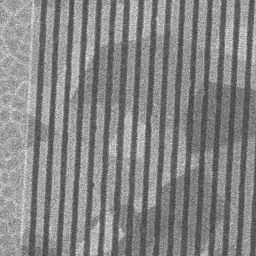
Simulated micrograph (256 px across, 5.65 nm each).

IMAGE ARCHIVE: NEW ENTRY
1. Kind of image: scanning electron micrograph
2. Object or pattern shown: parallel lines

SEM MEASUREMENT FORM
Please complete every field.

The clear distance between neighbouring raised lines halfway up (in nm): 29.6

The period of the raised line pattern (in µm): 0.078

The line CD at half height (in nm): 48.6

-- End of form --